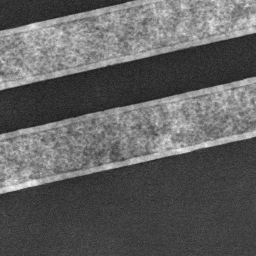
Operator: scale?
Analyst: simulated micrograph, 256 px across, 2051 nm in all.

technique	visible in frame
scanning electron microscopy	one or a few lines or trenches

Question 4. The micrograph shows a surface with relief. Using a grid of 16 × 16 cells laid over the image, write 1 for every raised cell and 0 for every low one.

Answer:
0000000111111111
0001111111111111
1111111111111000
1111111110000000
1111000000000000
0000000000000011
0000000001111111
0000011111111111
1111111111111110
1111111111100000
1111110000000000
1100000000000000
0000000000000000
0000000000000000
0000000000000000
0000000000000000